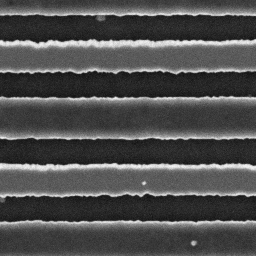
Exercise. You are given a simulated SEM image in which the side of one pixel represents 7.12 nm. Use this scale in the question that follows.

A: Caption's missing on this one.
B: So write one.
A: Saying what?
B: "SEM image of lines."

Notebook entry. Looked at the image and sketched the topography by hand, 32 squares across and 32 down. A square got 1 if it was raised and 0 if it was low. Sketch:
11111111111111111111111111111111
11111111111111111111111111111111
00000000000000000000000000000000
00000000000000000000000000000000
00000000000000000000000000000000
11110111111111111111111111111111
11111111111111111111111111111111
11111111111111111111111111111111
11111111111111111111111111111111
00000000000000000000000000000000
00000000000000000000000000000000
00000000000000000000000000000000
11111111111111111111111111111111
11111111111111111111111111111111
11111111111111111111111111111111
11111111111111111111111111111111
11111111111111111111111111111111
00000000000000000000000000000000
00000000000000000000000000000000
00000000000000000000000000000000
00000000000000000000000000000000
11111111111111111111111111111111
11111111111111111111111111111111
11111111111111111111111111111111
11100011100000100000000000000000
00000000000000000000000000000000
00000000000000000000000000000000
00000000000000000000000000000000
11111111111111111111111111111111
11111111111111111111111111111111
11111111111111111111111111111111
11111111111111111111111111111111